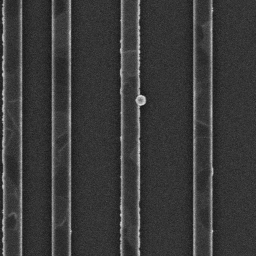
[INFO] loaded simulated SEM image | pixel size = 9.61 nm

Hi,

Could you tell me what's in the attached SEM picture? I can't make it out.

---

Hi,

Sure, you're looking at lines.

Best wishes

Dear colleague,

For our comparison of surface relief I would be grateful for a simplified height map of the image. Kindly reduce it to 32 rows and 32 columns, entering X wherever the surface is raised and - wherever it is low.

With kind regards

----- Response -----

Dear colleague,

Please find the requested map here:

XXX----XX------XX-------XX------
XXX----XX------XX-------XXX-----
XXX----XX------XX-------XX------
XXX----XX------XX-------XX------
XXX----XX------XX-------XX------
XXX----XX------XX-------XX------
XXX----XX------XX-------XX------
XXX----XX------XX-------XX------
XXX----XX------XX-------XX------
XXX----XX------XX-------XX------
XXX----XX------XX-------XX------
XXX----XX------XX-------XX------
XXX----XX------XXX------XX------
XXX----XX------XXX------XX------
XXX----XX------XX-------XX------
XXX----XX------XX-------XX------
XXX----XX------XX-------XX------
XXX----XX------XX-------XX------
XXX----XX------XX-------XX------
XXX----XX------XX-------XX------
XXX----XX------XX-------XX------
XXX----XX------XX-------XXX-----
XXX----XX------XX-------XX------
XXX----XX------XX-------XX------
XXX----XX------XX-------XX------
XXX----XX------XX-------XX------
XXX----XX------XX-------XX------
XXX----XX------XX-------XX------
XXX----XX------XX-------XXX-----
XXX----XX------XX-------XX------
XXX----XX------XX-------XX------
XXX----XX------XX-------XX------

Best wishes